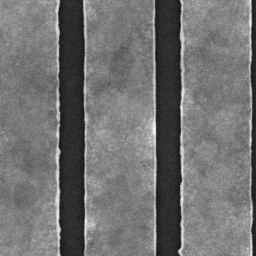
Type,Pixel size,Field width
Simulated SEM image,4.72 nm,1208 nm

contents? one or a few lines or trenches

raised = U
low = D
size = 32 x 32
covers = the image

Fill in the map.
UUUUUUUDDDUUUUUUUUUDDDDUUUUUUUUD
UUUUUUUDDDDUUUUUUUUDDDDUUUUUUUUD
UUUUUUUDDDDUUUUUUUUDDDDUUUUUUUUD
UUUUUUUDDDDUUUUUUUUDDDDUUUUUUUUD
UUUUUUUDDDDUUUUUUUUDDDDUUUUUUUUD
UUUUUUUDDDDUUUUUUUUDDDDUUUUUUUUD
UUUUUUUDDDDUUUUUUUUDDDDUUUUUUUUD
UUUUUUUDDDDUUUUUUUUDDDDUUUUUUUUD
UUUUUUUDDDDUUUUUUUUDDDDUUUUUUUUD
UUUUUUUDDDDUUUUUUUUDDDDUUUUUUUUD
UUUUUUUDDDDUUUUUUUUDDDDUUUUUUUUD
UUUUUUUDDDDUUUUUUUUDDDDUUUUUUUUD
UUUUUUUDDDDUUUUUUUUDDDDUUUUUUUUD
UUUUUUUDDDUUUUUUUUUDDDDUUUUUUUUD
UUUUUUUDDDDUUUUUUUUDDDDUUUUUUUUD
UUUUUUUDDDDUUUUUUUUDDDDUUUUUUUUD
UUUUUUUDDDDUUUUUUUUDDDDUUUUUUUUD
UUUUUUUDDDDUUUUUUUUDDDDUUUUUUUUD
UUUUUUUDDDDUUUUUUUUDDDDUUUUUUUUD
UUUUUUUDDDDUUUUUUUUDDDDUUUUUUUUD
UUUUUUUDDDDUUUUUUUUDDDDUUUUUUUUD
UUUUUUUDDDDUUUUUUUUDDDDUUUUUUUUD
UUUUUUUDDDDUUUUUUUUDDDDUUUUUUUUD
UUUUUUUDDDDUUUUUUUUDDDDUUUUUUUUD
UUUUUUUDDDDUUUUUUUUDDDDUUUUUUUUD
UUUUUUUDDDDUUUUUUUUDDDDUUUUUUUUD
UUUUUUUDDDDUUUUUUUUDDDDUUUUUUUUD
UUUUUUUDDDDUUUUUUUUDDDDUUUUUUUUD
UUUUUUUDDDDUUUUUUUUDDDDUUUUUUUUD
UUUUUUUUDDDUUUUUUUUDDDDUUUUUUUUD
UUUUUUUDDDDUUUUUUUUDDDDUUUUUUUUD
UUUUUUUDDDDUUUUUUUUDDDDUUUUUUUUD